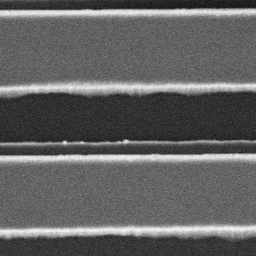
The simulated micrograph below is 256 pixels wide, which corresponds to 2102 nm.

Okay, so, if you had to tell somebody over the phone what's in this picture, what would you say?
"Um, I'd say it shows lines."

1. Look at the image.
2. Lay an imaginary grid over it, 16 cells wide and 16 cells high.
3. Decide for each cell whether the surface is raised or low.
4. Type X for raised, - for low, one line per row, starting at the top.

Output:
----------------
XXXXXXXXXXXXXXXX
XXXXXXXXXXXXXXXX
XXXXXXXXXXXXXXXX
XXXXXXXXXXXXXXXX
XXXXXXXXXX------
----------------
----------------
----------------
----------------
XXXXXXXXXXXXXXXX
XXXXXXXXXXXXXXXX
XXXXXXXXXXXXXXXX
XXXXXXXXXXXXXXXX
XX--------------
----------------